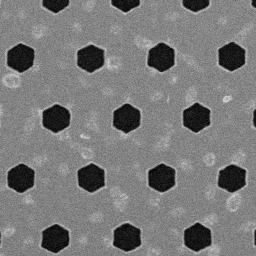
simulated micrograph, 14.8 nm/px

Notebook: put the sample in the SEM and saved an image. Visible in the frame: a regular array of holes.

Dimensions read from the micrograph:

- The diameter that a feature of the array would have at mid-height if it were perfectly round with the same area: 0.422 µm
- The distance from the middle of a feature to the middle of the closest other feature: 1030 nm